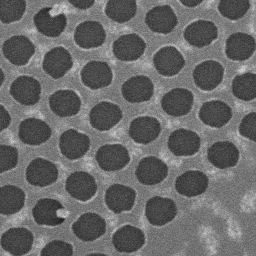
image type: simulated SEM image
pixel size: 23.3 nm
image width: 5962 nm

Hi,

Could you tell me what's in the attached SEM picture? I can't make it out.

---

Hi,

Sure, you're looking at a regular array of holes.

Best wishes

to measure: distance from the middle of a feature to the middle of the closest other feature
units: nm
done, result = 951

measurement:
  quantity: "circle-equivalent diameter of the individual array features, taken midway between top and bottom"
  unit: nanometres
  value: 736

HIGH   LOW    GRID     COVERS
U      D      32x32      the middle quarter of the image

DDUUUDDDDDDUUUUUUUUUUUDDDDDDDDUU
DUUUDDDDDDDDUUUUUUUUUUUDDDDDDUUU
DUUUDDDDDDDDUUUUUUUUUUUUDDDDDUUU
UUUUDDDDDDDDUUUUDDDDDDUUUUUUUUUU
UUUUDDDDDDDDUUUDDDDDDDUUUUUUUUUU
UUUUUDDDDDDUUUDDDDDDDDDUUUUUUUUU
DDUUUUUDUUUUUUDDDDDDDDDUUUDDDDDD
DDDDUUUUUUUUUUDDDDDDDDDUUDDDDDDD
DDDDUUUUUUUUUUUDDDDDDDUUDDDDDDDD
DDDDUUUUUDDDUUUUDDDDUUUUDDDDDDDD
DDDDUUUDDDDDDDUUUUUUUUUUDDDDDDDD
DDDDUUDDDDDDDDUUUUUUUUUUUDDDDDDD
DDDUUUDDDDDDDDDUUUUUUUUUUUDDDDDU
UUUUUUDDDDDDDDDUUDDDDDDUUUUUUUUU
UUUUUUDDDDDDDDUUUDDDDDDDUUUUUUUU
UUUUUUUDDDDDDUUUDDDDDDDDUUUUUUUU
DDDUUUUUDDDDUUUUDDDDDDDDDUUDDDDD
DDDDDUUUUUUUUUUUDDDDDDDDUUDDDDDD
DDDDDDUUUUUUUUUUUDDDDDDDUUDDDDDD
DDDDDDDUUUUUUUUUUDDDDDUUUUDDDDDD
DDDDDDDUUDDDDDDUUUUUUUUUUUDDDDDD
DDDDDDUUDDDDDDDDUUUUUUUUUUDDDDDD
DDDDDDUUDDDDDDDDUUUUUUUUUUUDDDDD
DDDDUUUUDDDDDDDDDUUUDDDDUUUUUUUU
UUUUUUUUDDDDDDDDUUUDDDDDDUUUUUUU
UUUUUUUUUDDDDDDDUUDDDDDDDDUUUUUU
UUUUUUUUUDDDDDUUUUDDDDDDDDUUUUUD
UDDDDDDUUUUUUUUUUUDDDDDDDDUUUDDD
UDDDDDDDUUUUUUUUUUDDDDDDDDUUDDDD
DDDDDDDDUUUUUUUUUUUDDDDDDUUUDDDD
DDDDDDDDUUUDDDDDUUUUUUUUUUUUDDDD
DDDDDDDDUUDDDDDDDDUUUUUUUUUUDDDD